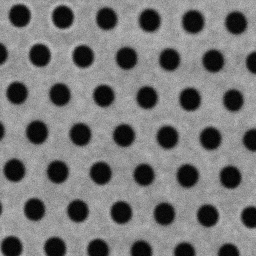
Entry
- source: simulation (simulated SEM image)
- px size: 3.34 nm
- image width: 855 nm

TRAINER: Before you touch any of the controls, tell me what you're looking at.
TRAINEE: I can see a regular array of holes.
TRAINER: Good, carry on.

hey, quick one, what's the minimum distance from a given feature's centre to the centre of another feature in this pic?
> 144 nm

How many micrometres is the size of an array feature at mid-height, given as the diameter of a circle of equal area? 0.0761